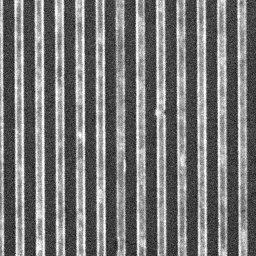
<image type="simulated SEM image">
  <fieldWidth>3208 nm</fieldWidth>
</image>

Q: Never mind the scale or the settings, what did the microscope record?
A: parallel lines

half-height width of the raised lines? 6.88 pixels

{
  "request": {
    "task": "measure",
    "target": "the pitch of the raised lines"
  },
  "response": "20.3 pixels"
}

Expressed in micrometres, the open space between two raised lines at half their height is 0.158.